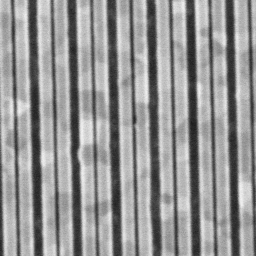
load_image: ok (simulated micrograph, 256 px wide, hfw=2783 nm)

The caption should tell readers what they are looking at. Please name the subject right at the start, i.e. parallel lines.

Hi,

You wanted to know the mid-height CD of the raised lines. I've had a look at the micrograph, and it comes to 120 nanometers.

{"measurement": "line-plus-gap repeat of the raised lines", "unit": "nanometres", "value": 215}